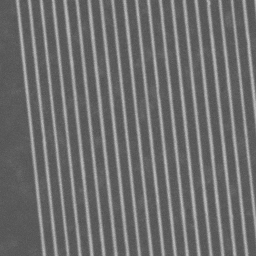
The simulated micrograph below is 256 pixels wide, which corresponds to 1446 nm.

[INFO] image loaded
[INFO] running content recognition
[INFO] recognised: parallel lines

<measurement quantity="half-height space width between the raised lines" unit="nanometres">55.5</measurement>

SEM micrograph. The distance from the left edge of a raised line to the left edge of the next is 11.8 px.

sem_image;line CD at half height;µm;0.0112